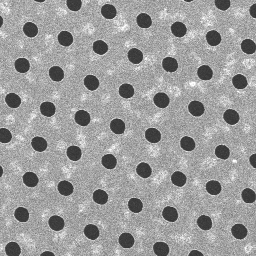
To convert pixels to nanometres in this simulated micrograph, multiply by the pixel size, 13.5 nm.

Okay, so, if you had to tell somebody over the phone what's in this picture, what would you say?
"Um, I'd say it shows a regular array of holes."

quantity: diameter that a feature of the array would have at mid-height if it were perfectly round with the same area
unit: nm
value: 211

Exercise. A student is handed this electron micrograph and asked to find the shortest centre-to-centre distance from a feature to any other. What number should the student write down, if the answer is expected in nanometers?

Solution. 485